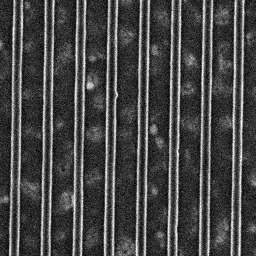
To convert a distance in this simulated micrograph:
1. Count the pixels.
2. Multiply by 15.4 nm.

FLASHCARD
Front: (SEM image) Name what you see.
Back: parallel lines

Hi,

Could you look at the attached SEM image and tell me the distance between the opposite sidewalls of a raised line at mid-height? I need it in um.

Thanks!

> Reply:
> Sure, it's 0.127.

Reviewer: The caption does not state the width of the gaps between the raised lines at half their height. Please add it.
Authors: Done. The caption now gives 23 pixels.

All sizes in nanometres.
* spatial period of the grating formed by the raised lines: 488